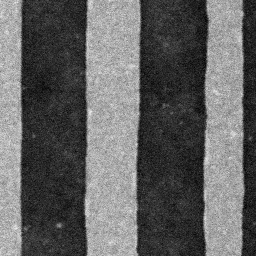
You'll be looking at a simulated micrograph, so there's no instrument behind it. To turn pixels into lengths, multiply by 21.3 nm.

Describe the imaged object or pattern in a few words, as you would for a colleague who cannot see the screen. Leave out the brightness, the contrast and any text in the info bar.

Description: one or a few lines or trenches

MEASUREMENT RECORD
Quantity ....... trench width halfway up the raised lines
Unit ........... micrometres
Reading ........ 1.44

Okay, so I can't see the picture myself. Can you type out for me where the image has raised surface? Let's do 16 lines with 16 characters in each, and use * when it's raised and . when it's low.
*.....***....**.
*....****....**.
*....****....**.
*....****....**.
*....****....**.
*....****....**.
*....****....**.
*.....***....**.
*....****....**.
*....****....**.
*....****....**.
*....***.....**.
*....***.....**.
*....***.....**.
*....***.....**.
*....***.....**.